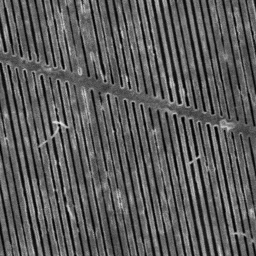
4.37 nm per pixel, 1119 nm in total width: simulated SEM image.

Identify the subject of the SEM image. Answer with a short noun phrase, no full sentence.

parallel lines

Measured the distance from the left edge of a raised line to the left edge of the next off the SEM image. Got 33.6 nanometers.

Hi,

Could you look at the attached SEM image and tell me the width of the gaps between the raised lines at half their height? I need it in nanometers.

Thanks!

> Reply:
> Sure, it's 11.8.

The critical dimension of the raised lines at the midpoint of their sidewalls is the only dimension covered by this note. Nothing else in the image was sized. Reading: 5.29 px